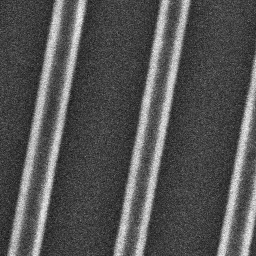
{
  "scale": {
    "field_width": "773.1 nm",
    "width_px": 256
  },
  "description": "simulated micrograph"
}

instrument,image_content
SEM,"one or a few lines or trenches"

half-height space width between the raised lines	0.245	um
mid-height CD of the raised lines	22.6	px